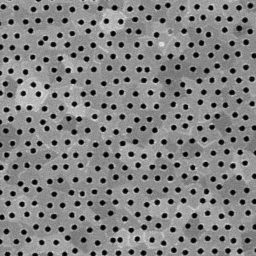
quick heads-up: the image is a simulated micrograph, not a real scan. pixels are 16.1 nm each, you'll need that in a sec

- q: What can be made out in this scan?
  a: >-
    a regular array of holes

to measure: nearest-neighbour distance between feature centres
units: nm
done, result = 188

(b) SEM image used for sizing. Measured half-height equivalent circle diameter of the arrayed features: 96.1 nm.